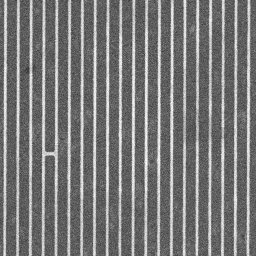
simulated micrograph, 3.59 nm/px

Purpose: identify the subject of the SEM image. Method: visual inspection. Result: parallel lines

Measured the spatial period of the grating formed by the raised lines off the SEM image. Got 46 nm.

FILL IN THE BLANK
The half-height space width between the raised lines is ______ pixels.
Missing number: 10.3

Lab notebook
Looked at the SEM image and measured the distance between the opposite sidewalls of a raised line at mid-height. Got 0.0094 microns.